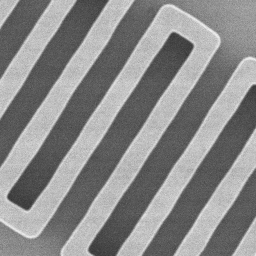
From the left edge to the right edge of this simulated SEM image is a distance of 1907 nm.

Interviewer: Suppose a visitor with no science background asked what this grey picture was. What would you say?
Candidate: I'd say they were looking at groups of lines, slits or small figures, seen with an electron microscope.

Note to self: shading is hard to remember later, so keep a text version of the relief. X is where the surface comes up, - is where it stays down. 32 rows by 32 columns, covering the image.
XX----XXX----XXX----------------
X-----XXX----XXX----XXX---------
X----XXX----XXX----XXXXXX-------
----XXX----XXX-----XXXXXXX------
----XXX----XXX----XXX--XXXX-----
---XXX----XXX----XXX----XXX-----
--XXX-----XXX----XXX----XXX-----
--XXX----XXX----XXX----XXX-----X
-XXX----XXX----XXX-----XXX----XX
XXX-----XXX----XXX----XXX----XXX
XXX----XXX----XXX----XXX----XXXX
XX----XXX----XXX-----XXX----XXX-
XX----XXX----XXX----XXX----XXX--
X----XXX----XXX----XXX----XXXX--
----XXX----XXX-----XXX----XXX---
----XXX----XXX----XXX----XXX----
---XXX----XXX----XXXX----XXX----
--XXXX----XXX----XXX----XXX----X
--XXX----XXX----XXX----XXX----XX
-XXX----XXX----XXXX----XXX----XX
XXXX----XXX----XXX----XXX----XXX
XXX----XXX----XXX----XXX-----XXX
XX----XXX-----XXX----XXX----XXX-
X-----XXX----XXX----XXX----XXX--
X----XXX----XXX----XXX-----XXX--
XX--XXX-----XXX----XXX----XXX---
XXXXXXX----XXX----XXX----XXX----
XXXXXX----XXX----XXXX----XXX----
-XXXX-----XXX----XXX----XXX----X
---XX----XXX----XXX----XXX-----X
--------XXX----XXXX----XXX----XX
--------XXX----XXX----XXX----XXX